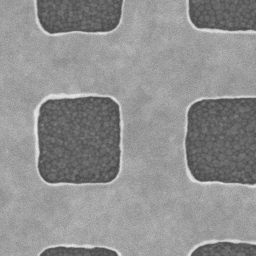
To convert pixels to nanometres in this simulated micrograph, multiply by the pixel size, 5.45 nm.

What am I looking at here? holes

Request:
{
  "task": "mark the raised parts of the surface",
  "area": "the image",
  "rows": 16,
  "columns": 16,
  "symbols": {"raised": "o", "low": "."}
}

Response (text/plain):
oo......oooo....
ooo....ooooo....
oooooooooooooooo
oooooooooooooooo
oooooooooooooooo
oooooooooooooooo
ooo....ooooo....
oo......oooo....
oo......oooo....
oo......oooo....
oo.....ooooo....
ooooooooooooooo.
oooooooooooooooo
oooooooooooooooo
oooooooooooooooo
ooo...oooooo....